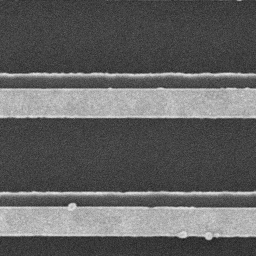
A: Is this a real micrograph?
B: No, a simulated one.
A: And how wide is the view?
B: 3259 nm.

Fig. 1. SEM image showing lines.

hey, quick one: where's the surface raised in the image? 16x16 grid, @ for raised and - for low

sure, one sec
----------------
----------------
----------------
----------------
----------------
@@@@@@@@@@@@@@@@
@@@@@@@@@@@@@@@@
----------------
----------------
----------------
----------------
----------------
@@@@@@@@@@@@@@@@
@@@@@@@@@@@@@@@@
@@@@@@@@@@@@@@@@
----------------